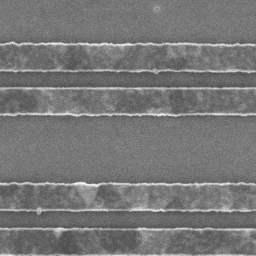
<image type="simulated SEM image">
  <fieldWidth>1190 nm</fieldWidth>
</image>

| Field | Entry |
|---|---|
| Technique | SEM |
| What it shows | lines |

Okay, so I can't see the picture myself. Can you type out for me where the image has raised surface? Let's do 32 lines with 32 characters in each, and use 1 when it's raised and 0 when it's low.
00000000000000000000000000000000
00000000000000000000000000000000
00000000000000000000000000000000
00000000000000000000000000000000
00000000000000000000000000000000
11110111011000000110111100000000
11111111111111111111111111111111
11111111111111111111111111111111
11111111111111111111111111111111
00000000000000000000000000000000
00000000000000000000000000000000
11111111111111111111111111111111
11111111111111111111111111111111
11111111111111111111111111111111
00000000000000000000000000000000
00000000000000000000000000000000
00000000000000000000000000000000
00000000000000000000000000000000
00000000000000000000000000000000
00000000000000000000000000000000
00000000000000000000000000000000
00000000000000000000000000000000
00000000000000000000000000000000
11111111111111111111111111111111
11111111111111111111111111111111
11111111111111111111111111111111
00001000000000000000000000000000
00000000000000000000000000000000
00000000000000000000000000000000
11111111111111111111111111111111
11111111111111111111111111111111
11111111111111111111111111111111